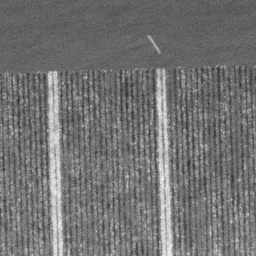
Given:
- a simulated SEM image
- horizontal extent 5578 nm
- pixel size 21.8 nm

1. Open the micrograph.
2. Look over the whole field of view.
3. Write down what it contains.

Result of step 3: parallel lines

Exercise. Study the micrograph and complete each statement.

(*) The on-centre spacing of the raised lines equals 0.118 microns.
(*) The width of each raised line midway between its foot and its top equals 62.6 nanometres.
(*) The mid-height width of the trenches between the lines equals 54.5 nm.